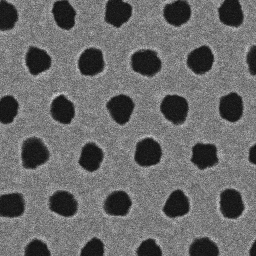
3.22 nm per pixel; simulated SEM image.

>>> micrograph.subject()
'a regular array of holes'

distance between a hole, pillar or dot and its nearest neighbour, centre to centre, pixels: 53.6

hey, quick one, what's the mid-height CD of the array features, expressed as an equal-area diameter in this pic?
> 84.6 nm